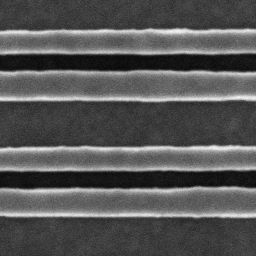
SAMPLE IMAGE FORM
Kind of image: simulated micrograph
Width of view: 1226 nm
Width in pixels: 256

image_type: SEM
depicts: lines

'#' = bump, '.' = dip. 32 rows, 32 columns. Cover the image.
................................
................................
................................
................................
################################
################################
################################
................................
................................
################################
################################
################################
####.###..####.#############....
................................
................................
................................
................................
................................
...##.##########.###############
################################
################################
................................
................................
........................#######.
################################
################################
################################
................................
................................
................................
................................
................................